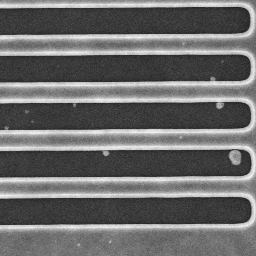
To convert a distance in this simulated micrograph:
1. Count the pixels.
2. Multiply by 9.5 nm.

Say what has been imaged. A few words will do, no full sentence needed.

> groups of lines, slits or small figures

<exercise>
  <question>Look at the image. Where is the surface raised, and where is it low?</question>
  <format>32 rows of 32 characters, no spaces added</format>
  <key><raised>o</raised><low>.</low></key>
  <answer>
oooooooooooooooooooooooooooooooo
...............................o
................................
...............................o
...........oo...oooooooooooooooo
oooooooooooooooooooooooooooooooo
oooooooooooooooooooooooooooooooo
...............................o
................................
...............................o
........oooooooooooooooooooooooo
oooooooooooooooooooooooooooooooo
ooooooooooooooooooooooooo.....oo
................................
................................
...............................o
..oooooooooooooooooooooooooooooo
oooooooooooooooooooooooooooooooo
oooooooooooooooo.oo...........oo
................................
................................
...............................o
oooooooooooooooooooooooooooooooo
oooooooooooooooooooooooooooooooo
oooooooooooooo................oo
................................
................................
...............................o
oooooooooooooooooooooooooooooooo
oooooooooooooooooooooooooooooooo
oooooooooooooooooooooooooooooooo
oooooooooooooooooooooooooooooooo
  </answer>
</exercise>